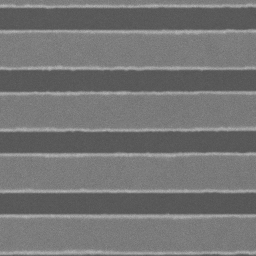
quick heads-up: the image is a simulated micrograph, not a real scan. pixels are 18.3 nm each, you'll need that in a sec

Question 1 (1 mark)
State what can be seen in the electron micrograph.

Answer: lines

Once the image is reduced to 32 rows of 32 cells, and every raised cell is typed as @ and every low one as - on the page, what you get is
@@@@@@@@@@@@@@@@@@@@@@@@@@@@@@@@
--------------------------------
--------------------------------
--------------------------------
@@@@@@@@@@@@@@@@@@@@@@@@@@@@@@@@
@@@@@@@@@@@@@@@@@@@@@@@@@@@@@@@@
@@@@@@@@@@@@@@@@@@@@@@@@@@@@@@@@
@@@@@@@@@@@@@@@@@@@@@@@@@@@@@@@@
@@@@@@@@@@@@@@@@@@@@@@@@@@@@@@@@
--------------------------------
--------------------------------
------------@@@@----@@@-@@@@@@@@
@@@@@@@@@@@@@@@@@@@@@@@@@@@@@@@@
@@@@@@@@@@@@@@@@@@@@@@@@@@@@@@@@
@@@@@@@@@@@@@@@@@@@@@@@@@@@@@@@@
@@@@@@@@@@@@@@@@@@@@@@@@@@@@@@@@
--------------------------------
--------------------------------
--------------------------------
@@@@@@@@@@@@@@@@@@@@@@@@@@@@@@@@
@@@@@@@@@@@@@@@@@@@@@@@@@@@@@@@@
@@@@@@@@@@@@@@@@@@@@@@@@@@@@@@@@
@@@@@@@@@@@@@@@@@@@@@@@@@@@@@@@@
@@@@@@@@@@@@@@@@@@@@@@@@@@@@@@@@
--------------------------------
--------------------------------
--------------------------------
@@@@@@@@@@@@@@@@@@@@@@@@@@@@@@@@
@@@@@@@@@@@@@@@@@@@@@@@@@@@@@@@@
@@@@@@@@@@@@@@@@@@@@@@@@@@@@@@@@
@@@@@@@@@@@@@@@@@@@@@@@@@@@@@@@@
@@@@@@@@@@@@@@@@@@@@@@@@@@@@@@@@